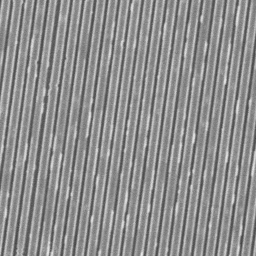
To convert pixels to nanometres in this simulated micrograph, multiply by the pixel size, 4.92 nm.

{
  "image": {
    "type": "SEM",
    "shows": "parallel lines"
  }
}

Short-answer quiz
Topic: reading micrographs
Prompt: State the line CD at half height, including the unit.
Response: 7.8 px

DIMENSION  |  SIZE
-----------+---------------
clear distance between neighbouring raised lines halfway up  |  19.5 nanometers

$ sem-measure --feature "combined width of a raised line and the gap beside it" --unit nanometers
57.9